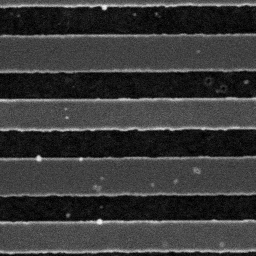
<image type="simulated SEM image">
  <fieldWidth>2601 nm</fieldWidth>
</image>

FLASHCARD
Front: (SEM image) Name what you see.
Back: lines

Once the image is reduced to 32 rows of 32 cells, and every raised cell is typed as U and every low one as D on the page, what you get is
UUUUUUUUUUUUUUUUUUUUUUUUUUUUUUUU
DDDDDDDDDDDDDDDDDDDDDDDDDDDDDDDD
DDDDDDDDDDDDDDDDDDDDDDDDDDDDDDDD
DDDDDDDDDDDDDDDDDDDDDDDDDDDDDDDD
DDDDDDDDDUUUUUUUUUUUUUUUUUUUUUUU
UUUUUUUUUUUUUUUUUUUUUUUUUUUUUUUU
UUUUUUUUUUUUUUUUUUUUUUUUUUUUUUUU
UUUUUUUUUUUUUUUUUUUUUUUUUUUUUUUU
UUUUUUUUUUUUUUUUUUUUUUUUUUUUUUUU
DDDDDDDDDDDDDDDDDDDDDDDDDDDDDDDD
DDDDDDDDDDDDDDDDDDDDDDDDDDDDDDDD
DDDDDDDDDDDDDDDDDDDDDDDDDDDDDDDD
UUUUUUUUUUUUUUUUUUUUUUUUUUUUUUUU
UUUUUUUUUUUUUUUUUUUUUUUUUUUUUUUU
UUUUUUUUUUUUUUUUUUUUUUUUUUUUUUUU
UUUUUUUUUUUUUUUUUUUUUUUUUUUUUUUU
DDDDDDDDDDDDDDDDDDDDDDDDDDDDDDDD
DDDDDDDDDDDDDDDDDDDDDDDDDDDDDDDD
DDDDDDDDDDDDDDDDDDDDDDDDDDDDDDDD
DDDDDDDDDDDDDDDDDDDDDDDDDDDDDDDD
UUUUUUUUUUUUUUUUUUUUUUUUUUUUUUUU
UUUUUUUUUUUUUUUUUUUUUUUUUUUUUUUU
UUUUUUUUUUUUUUUUUUUUUUUUUUUUUUUU
UUUUUUUUUUUUUUUUUUUUUUUUUUUUUUUU
UDDDDDDDDDDDDDDDDDDDDDDDDDDDDDDD
DDDDDDDDDDDDDDDDDDDDDDDDDDDDDDDD
DDDDDDDDDDDDDDDDDDDDDDDDDDDDDDDD
DDDDDDDDDDDDDDDDDDDDDDDDDDDDDDDD
UUUUUUUUUUUUUUUUUUUUUUUUUUUUUUUU
UUUUUUUUUUUUUUUUUUUUUUUUUUUUUUUU
UUUUUUUUUUUUUUUUUUUUUUUUUUUUUUUU
UUUUUUUUUUUUDDDUDDDDDDDDDDDUDDDD